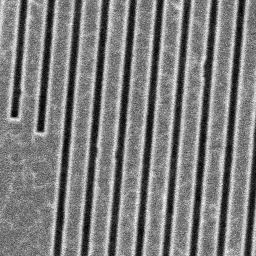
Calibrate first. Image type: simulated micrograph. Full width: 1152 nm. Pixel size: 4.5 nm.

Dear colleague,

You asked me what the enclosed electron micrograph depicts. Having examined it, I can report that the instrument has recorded parallel lines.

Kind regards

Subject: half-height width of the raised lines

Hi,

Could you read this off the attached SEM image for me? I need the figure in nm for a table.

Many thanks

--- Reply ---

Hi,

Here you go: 84.1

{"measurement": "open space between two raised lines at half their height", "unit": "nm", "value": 38.1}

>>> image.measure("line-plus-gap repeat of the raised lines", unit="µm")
0.122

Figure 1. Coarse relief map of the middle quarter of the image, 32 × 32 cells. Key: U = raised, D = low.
UDDUUUUUDDUUUUUDDUUUUDDDUUUUDDDU
UDDUUUUUDDUUUUUDDUUUUDDDUUUUDDDU
UDDUUUUUDDUUUUUDDUUUUDDDUUUUDDUU
UDDUUUUUDDUUUUDDDUUUUDDDUUUUDDUU
UDDUUUUUDDUUUUDDDUUUUDDUUUUUDDUU
UDDUUUUDDDUUUUDDDUUUUDDUUUUUDDUU
UDDUUUUDDDUUUUDDUUUUUDDUUUUUDDUU
DDDUUUUDDDUUUUDDUUUUUDDUUUUUDDUU
DDDUUUUDDDUUUUDDUUUUUDDUUUUUDDUU
DDDUUUUDDUUUUUDDUUUUUDDUUUUUDDUU
DDDUUUUDDUUUUUDDUUUUUDDUUUUDDDUU
DDUUUUUDDUUUUUDDUUUUUDDUUUUDDDUU
DDUUUUUDDUUUUUDDUUUUDDDUUUUDDDUU
DDUUUUUDDUUUUUDDUUUUDDDUUUUDDUUU
DDUUUUUDDUUUUDDDUUUUDDDUUUUDDUUU
DDUUUUUDDUUUUDDDUUUUDDDUUUUDDUUU
DDUUUUUDDUUUUDDDUUUUDDUUUUUDDUUU
DDUUUUDDDUUUUDDDUUUUDDUUUUUDDUUU
DDUUUUDDDUUUUDDUUUUUDDUUUUUDDUUU
DDUUUUDDDUUUUDDUUUUUDDUUUUUDDUUU
DDUUUUDDUUUUUDDUUUUUDDUUUUUDDUUU
DDUUUUDDDUUUUDDUUUUUDDUUUUUDDUUU
DDUUUUDDDUUUUDDUUUUUDDUUUUDDDUUU
DUUUUUDDUUUUUDDUUUUUDDUUUUDDDUUU
DUUUUUDDUUUUUDDUUUUDDDUUUUDDDUUU
DUUUUUDDUUUUUDDUUUUDDDUUUUDDUUUU
DUUUUUDDUUUUDDDUUUUDDDUUUUDDUUUU
DUUUUUDDUUUUDDDUUUUDDDUUUUDDUUUU
DUUUUDDDUUUUDDDUUUUDDUUUUUDDUUUU
DUUUUDDDUUUUDDDUUUUDDUUUUUDDUUUU
DUUUUDDDUUUUDDUUUUUDDUUUUUDDUUUU
DUUUUDDDUUUUDDUUUUUDDUUUUUDDUUUU